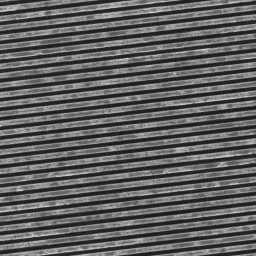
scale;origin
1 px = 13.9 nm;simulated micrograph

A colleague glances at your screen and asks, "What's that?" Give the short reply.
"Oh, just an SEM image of parallel lines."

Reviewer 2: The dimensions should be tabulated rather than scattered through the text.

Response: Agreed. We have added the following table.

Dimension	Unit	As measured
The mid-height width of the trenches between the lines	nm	79.4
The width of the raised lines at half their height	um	0.0534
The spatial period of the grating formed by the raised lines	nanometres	132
